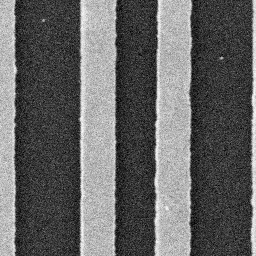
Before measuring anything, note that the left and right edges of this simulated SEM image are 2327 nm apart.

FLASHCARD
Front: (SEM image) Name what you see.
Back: lines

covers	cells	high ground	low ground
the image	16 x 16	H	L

HLLLLHHLLLHHLLLL
HLLLLHHLLLHHLLLL
HLLLLHHLLLHHLLLL
HLLLLHHLLLHHLLLL
HLLLLHHLLLHHLLLL
HLLLLHHLLLHHLLLL
HLLLLHHLLLHHLLLL
HLLLLHHLLLHHLLLL
HLLLLHHLLLHHLLLL
HLLLLHHLLLHHLLLL
HLLLLHHLLLHHLLLL
HLLLLHHLLLHHLLLL
HLLLLHHLLLHHLLLL
HLLLLHHLLLHHLLLL
HLLLLHHLLLHHLLLL
HLLLLHHLLLHHLLLL